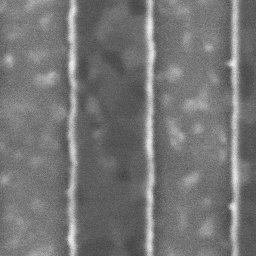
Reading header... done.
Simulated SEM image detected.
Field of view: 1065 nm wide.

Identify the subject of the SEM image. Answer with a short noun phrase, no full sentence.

one or a few lines or trenches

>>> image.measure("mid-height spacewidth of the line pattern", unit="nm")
343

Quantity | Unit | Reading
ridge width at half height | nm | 333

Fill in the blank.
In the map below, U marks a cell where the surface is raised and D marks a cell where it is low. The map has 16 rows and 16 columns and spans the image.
DDDDUUUUUDDDDDDU
DDDDUUUUUDDDDDDU
DDDDUUUUUDDDDDDU
DDDDUUUUUUDDDDDU
DDDDUUUUUDDDDDDU
DDDDDUUUUDDDDDDU
DDDDDUUUUDDDDDDU
DDDDUUUUUDDDDDDU
DDDDUUUUUDDDDDDU
DDDDUUUUUDDDDDDU
DDDDDUUUUUDDDDDU
DDDDUUUUUUDDDDDU
DDDDUUUUUDDDDDDU
DDDDUUUUUDDDDDDU
DDDDUUUUUDDDDDDU
DDDDUUUUUDDDDDDU